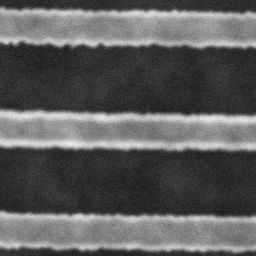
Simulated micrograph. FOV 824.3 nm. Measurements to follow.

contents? lines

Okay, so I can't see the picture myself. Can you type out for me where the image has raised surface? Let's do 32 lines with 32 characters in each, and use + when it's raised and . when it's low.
................................
+++++++++++++.+.++++.+..........
++++++++++++++++++++++++++++++++
++++++++++++++++++++++++++++++++
++++++++++++++++++++++++++++++++
....+..++++++++++++.++++++++++++
................................
................................
................................
................................
................................
................................
................................
................................
+++++++++++++++++++++++..+......
++++++++++++++++++++++++++++++++
++++++++++++++++++++++++++++++++
++++++++++++++++++++++++++++++++
....................+++.++++++++
................................
................................
................................
................................
................................
................................
................................
................................
++++++++++++++++++++++++++++++++
++++++++++++++++++++++++++++++++
++++++++++++++++++++++++++++++++
++++++++++++++++++++++++++++++++
................................